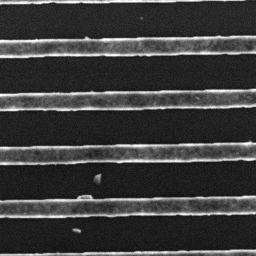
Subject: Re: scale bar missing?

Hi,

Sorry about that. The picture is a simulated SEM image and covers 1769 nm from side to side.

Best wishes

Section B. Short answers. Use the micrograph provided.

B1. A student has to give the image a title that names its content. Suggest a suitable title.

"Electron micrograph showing lines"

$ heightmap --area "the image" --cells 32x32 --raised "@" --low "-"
--------------------------------
--------------------------------
--------------------------------
--------------------------------
--------------------------------
@@@@@@@@@@@@@@@@@@@@@@@@@@@@@@@@
@@@@@@@@@@@@@@@@@@@@@@@@@@@@@@@@
--------------------------------
--------------------------------
--------------------------------
--------------------------------
-------------@@@@@@@@@@@@@@@@@@@
@@@@@@@@@@@@@@@@@@@@@@@@@@@@@@@@
@@@@@@@@@@@@@@@@@@@@@-----------
--------------------------------
--------------------------------
--------------------------------
--------------------------------
@@@@@@@@@@@@@@@@@@@@@@@@@@@@@@@@
@@@@@@@@@@@@@@@@@@@@@@@@@@@@@@@@
@@@@@@--------------------------
--------------------------------
--------------------------------
--------------------------------
--------------------------------
@@@@@@@@@@@@@@@@@@@@@@@@@@@@@@@@
@@@@@@@@@@@@@@@@@@@@@@@@@@@@@@@@
--------------------------------
--------------------------------
--------------------------------
--------------------------------
------------------@@@@@@@@@@@@@@